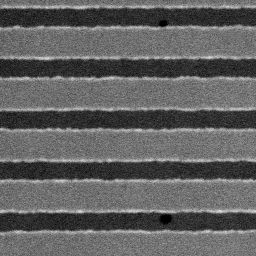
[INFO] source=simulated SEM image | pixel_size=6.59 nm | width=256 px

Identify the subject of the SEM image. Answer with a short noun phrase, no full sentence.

lines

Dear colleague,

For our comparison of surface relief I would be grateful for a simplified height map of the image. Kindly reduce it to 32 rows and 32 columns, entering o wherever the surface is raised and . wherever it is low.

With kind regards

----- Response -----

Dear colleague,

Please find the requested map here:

oooooooooooooooooooooooooooooooo
................................
................................
oooooooooooooooooooooooooooooooo
oooooooooooooooooooooooooooooooo
oooooooooooooooooooooooooooooooo
oooooooooooooooooooooooooooooooo
................................
................................
................................
oooooooooooooooooooooooooooooooo
oooooooooooooooooooooooooooooooo
oooooooooooooooooooooooooooooooo
oooooooooooooooooooooooooooooooo
................................
................................
oooooooooooooooooooooooooooooooo
oooooooooooooooooooooooooooooooo
oooooooooooooooooooooooooooooooo
oooooooooooooooooooooooooooooooo
................................
................................
ooo......oooo.oo.....ooooooooo.o
oooooooooooooooooooooooooooooooo
oooooooooooooooooooooooooooooooo
oooooooooooooooooooooooooooooooo
..oo............................
................................
................................
oooooooooooooooooooooooooooooooo
oooooooooooooooooooooooooooooooo
oooooooooooooooooooooooooooooooo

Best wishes